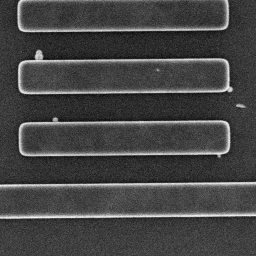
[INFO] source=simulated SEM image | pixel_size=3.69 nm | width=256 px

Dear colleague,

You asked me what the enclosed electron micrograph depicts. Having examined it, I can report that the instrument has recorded groups of lines, slits or small figures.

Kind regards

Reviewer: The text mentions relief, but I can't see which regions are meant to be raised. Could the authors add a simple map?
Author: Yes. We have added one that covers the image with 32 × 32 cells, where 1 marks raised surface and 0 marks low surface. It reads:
00111111111111111111111111110000
00111111111111111111111111110000
00111111111111111111111111110000
00111111111111111111111111110000
00000000000000000000000000000000
00000000000000000000000000000000
00000000000000000000000000000000
00000000001111111111111111110000
00111111111111111111111111111000
00111111111111111111111111111000
00111111111111111111111111111000
00011111111111111111111111100000
00000000000000000000000000000000
00000000000000000000000000000000
00000000000000000000000000000000
00011111111111111111111111110000
00111111111111111111111111111000
00111111111111111111111111111000
00111111111111111111111111111000
00000000000000000000000000000000
00000000000000000000000000000000
00000000000000000000000000000000
00000000000000000000000000000000
11111111111111111111111111111111
11111111111111111111111111111111
11111111111111111111111111111111
11111111111111111111111111111111
00000000000000000000000000000000
00000000000000000000000000000000
00000000000000000000000000000000
00000000000000000000000000000000
00000000000000000000000000000000